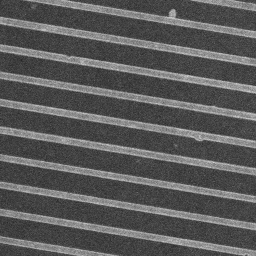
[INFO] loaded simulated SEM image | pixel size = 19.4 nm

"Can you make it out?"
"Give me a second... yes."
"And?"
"parallel lines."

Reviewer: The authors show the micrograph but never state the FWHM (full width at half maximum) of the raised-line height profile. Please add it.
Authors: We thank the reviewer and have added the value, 113 nanometers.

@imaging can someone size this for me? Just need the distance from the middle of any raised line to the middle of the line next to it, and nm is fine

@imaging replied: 526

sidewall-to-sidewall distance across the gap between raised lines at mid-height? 0.413 µm